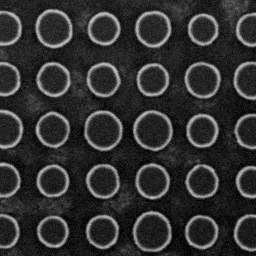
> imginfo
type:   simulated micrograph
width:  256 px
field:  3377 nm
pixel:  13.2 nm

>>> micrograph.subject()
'a regular array of raised bodies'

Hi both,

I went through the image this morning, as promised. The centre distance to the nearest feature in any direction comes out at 0.651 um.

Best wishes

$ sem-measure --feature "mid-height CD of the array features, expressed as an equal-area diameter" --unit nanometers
422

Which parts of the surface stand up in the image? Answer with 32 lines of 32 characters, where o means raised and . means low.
................................
o.....o.........................
oo...oooo...oo...oooo...ooo...oo
ooo..oooo..oooo..oooo...ooo...oo
oo...oooo..oooo..oooo...ooo...oo
o.....oo..........oo.....o.....o
................................
................................
oo...ooo....oo....oo....ooo...oo
oo...oooo..oooo..oooo..oooo..ooo
oo...oooo..oooo..oooo..oooo..ooo
oo....oo....oo....oo....ooo...oo
................................
................................
oo....o....ooo....ooo....o.....o
ooo..ooo...oooo..oooo...ooo...oo
ooo..oooo..oooo..oooo...ooo..ooo
oo...ooo...oooo..oooo...ooo...oo
............oo....oo............
................................
................................
oo...ooo...ooo...oooo...ooo...oo
oo...ooo...oooo..oooo..oooo...oo
oo...ooo...oooo..oooo...ooo...oo
o...........oo....oo....oo.....o
................................
................................
oo....oo....oo...oooo...oo....oo
oo...ooo...oooo..oooo..oooo...oo
oo...ooo...oooo..oooo..oooo..ooo
o.....oo....oo...oooo...oo....oo
................................